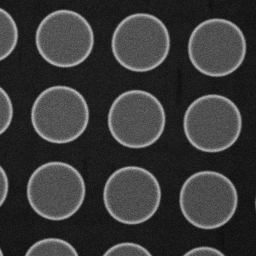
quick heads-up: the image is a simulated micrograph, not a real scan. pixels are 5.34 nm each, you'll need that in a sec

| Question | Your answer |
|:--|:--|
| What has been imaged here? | an array of small figures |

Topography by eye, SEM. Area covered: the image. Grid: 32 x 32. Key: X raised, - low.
--------------------------------
X------XX-----------------------
XX---XXXXXX----XXXXX------XX----
XX---XXXXXX----XXXXXX----XXXXX--
XX---XXXXXXX--XXXXXXX---XXXXXX--
XX---XXXXXXX--XXXXXXX---XXXXXXX-
X----XXXXXX---XXXXXXX---XXXXXXX-
------XXXX-----XXXXX----XXXXXX--
----------------XXX------XXXXX--
---------------------------X----
--------------------------------
X----XXXXX------XX--------------
X----XXXXXX---XXXXXX-----XXXX---
XX--XXXXXXX---XXXXXX----XXXXXX--
XX--XXXXXXX---XXXXXXX--XXXXXXX--
X---XXXXXXX---XXXXXXX--XXXXXXX--
-----XXXXX----XXXXXX---XXXXXXX--
------XXX------XXXX-----XXXXXX--
-------------------------XXX----
--------------------------------
------XX------------------------
X---XXXXXX----XXXXX------XX-----
X---XXXXXX---XXXXXXX---XXXXXX---
X--XXXXXXXX--XXXXXXX---XXXXXX---
X--XXXXXXXX--XXXXXXX---XXXXXXX--
----XXXXXX---XXXXXXX--XXXXXXXX--
-----XXXX-----XXXXX----XXXXXX---
---------------XXX-----XXXXXX---
-------------------------XX-----
--------------------------------
----XXXXX------XX---------------
---XXXXXXX---XXXXXX-----XXX-----